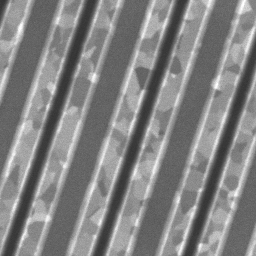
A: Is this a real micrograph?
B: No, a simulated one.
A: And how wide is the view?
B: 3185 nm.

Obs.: parallel lines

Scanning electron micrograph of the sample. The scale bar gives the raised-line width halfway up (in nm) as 295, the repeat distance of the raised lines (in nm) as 529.